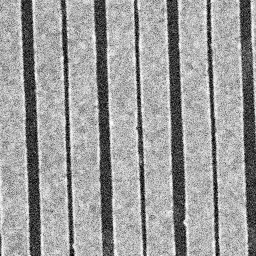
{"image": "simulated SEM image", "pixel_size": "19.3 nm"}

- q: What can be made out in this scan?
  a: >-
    parallel lines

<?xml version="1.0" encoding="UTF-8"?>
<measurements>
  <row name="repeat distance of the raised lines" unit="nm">691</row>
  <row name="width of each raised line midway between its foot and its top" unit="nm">524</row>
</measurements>